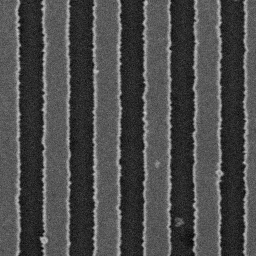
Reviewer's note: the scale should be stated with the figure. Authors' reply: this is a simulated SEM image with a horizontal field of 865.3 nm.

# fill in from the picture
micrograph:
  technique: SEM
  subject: lines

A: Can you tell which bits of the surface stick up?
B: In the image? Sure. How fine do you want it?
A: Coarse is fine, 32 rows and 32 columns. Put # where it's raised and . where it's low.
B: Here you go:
##...####...###...###...###....#
##...####...###...###...###....#
##...####...###...###...####...#
##...####...###...###...###....#
##...####...###...###...####...#
##....###...###...###...####...#
##...####...###...###...####...#
##...####...###...###...####...#
##...####...###...###...###....#
##...####...###...###...####...#
##...####...###...###...####...#
##...####...###...###...####...#
##...####...###...###...####...#
##...####...###...###...####...#
##...####...###...###...####...#
##...####...###...###...####...#
##...####...###...###...####...#
##...####...###...###...###....#
##...####...###...###...####...#
##...####...###...###...####...#
##...####...###...###...####...#
##...####...###...###...####...#
##...####...###...###...####...#
##...####...###...###...###....#
##...####...###...###...####...#
##...####...###...###...####...#
##...####...###...###...####...#
##...####...###...###...####...#
###..####...###...###...###....#
##...####...###...###...####...#
##...####...###...###...####...#
##...####...###...###...####..##